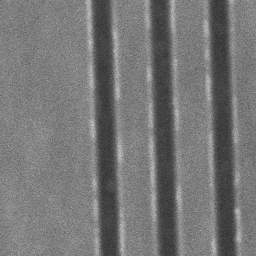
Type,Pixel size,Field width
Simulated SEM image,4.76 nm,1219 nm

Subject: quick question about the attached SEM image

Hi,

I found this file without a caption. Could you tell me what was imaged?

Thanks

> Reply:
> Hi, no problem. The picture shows parallel lines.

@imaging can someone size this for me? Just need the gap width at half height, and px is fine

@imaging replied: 19.1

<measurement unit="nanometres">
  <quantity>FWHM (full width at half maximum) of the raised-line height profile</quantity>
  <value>187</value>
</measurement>